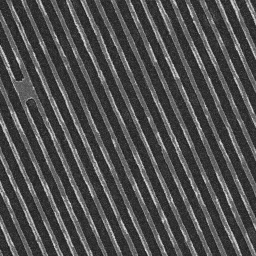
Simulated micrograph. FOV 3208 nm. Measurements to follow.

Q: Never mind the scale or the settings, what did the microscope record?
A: parallel lines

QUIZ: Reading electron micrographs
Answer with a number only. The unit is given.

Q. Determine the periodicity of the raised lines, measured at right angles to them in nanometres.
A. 171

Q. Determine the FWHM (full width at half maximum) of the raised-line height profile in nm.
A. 54.5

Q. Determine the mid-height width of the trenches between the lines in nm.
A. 115